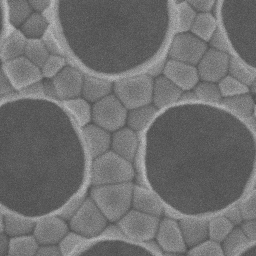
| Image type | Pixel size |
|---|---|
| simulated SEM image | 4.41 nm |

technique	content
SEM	holes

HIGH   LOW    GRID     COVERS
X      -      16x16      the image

XXX--------XXX--
XXXX-------XXX--
XXXX------XXXX--
XXXXX-----XXXXX-
XXXXXX--XXXXXXXX
XXXXXXXXXXXXXXXX
---XXXXXXXXX-XXX
----XXXXXX-----X
-----XXXX-------
-----XXXX-------
-----XXXX-------
-----XXXX-------
----XXXXXX-----X
X--XXXXXXXXX-XXX
XXXXXXXXXXXXXXXX
XXXXX----XXXXXXX